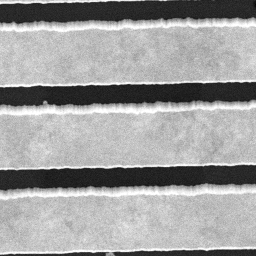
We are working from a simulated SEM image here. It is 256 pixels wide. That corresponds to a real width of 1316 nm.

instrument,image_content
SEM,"lines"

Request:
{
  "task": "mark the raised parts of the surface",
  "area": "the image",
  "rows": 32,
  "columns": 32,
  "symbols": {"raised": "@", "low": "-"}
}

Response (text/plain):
--------------------------------
--------------------------------
--------------------------------
@@@@@@@@@@@@@@@@@@@@@@@@@@@@@@@@
@@@@@@@@@@@@@@@@@@@@@@@@@@@@@@@@
@@@@@@@@@@@@@@@@@@@@@@@@@@@@@@@@
@@@@@@@@@@@@@@@@@@@@@@@@@@@@@@@@
@@@@@@@@@@@@@@@@@@@@@@@@@@@@@@@@
@@@@@@@@@@@@@@@@@@@@@@@@@@@@@@@@
@@@@@@@@@@@@@@@@@@@@@@@@@@@@@@@@
@@@@@@@@@@@@@@@-----------------
--------------------------------
--------------------------------
-----@@-@--@@@@@@@@@@@@@@@@@@@@@
@@@@@@@@@@@@@@@@@@@@@@@@@@@@@@@@
@@@@@@@@@@@@@@@@@@@@@@@@@@@@@@@@
@@@@@@@@@@@@@@@@@@@@@@@@@@@@@@@@
@@@@@@@@@@@@@@@@@@@@@@@@@@@@@@@@
@@@@@@@@@@@@@@@@@@@@@@@@@@@@@@@@
@@@@@@@@@@@@@@@@@@@@@@@@@@@@@@@@
@@@@@@@@@@@@@@@@@@@@@@@@@@@@@@@@
--------------------------------
--------------------------------
---------------------@---@@@@@@@
@@@@@@@@@@@@@@@@@@@@@@@@@@@@@@@@
@@@@@@@@@@@@@@@@@@@@@@@@@@@@@@@@
@@@@@@@@@@@@@@@@@@@@@@@@@@@@@@@@
@@@@@@@@@@@@@@@@@@@@@@@@@@@@@@@@
@@@@@@@@@@@@@@@@@@@@@@@@@@@@@@@@
@@@@@@@@@@@@@@@@@@@@@@@@@@@@@@@@
@@@@@@@@@@@@@@@@@@@@@@@@@@@@@@@@
@@@@@@@@@@-@--------------------